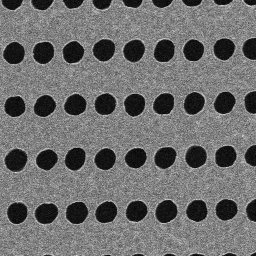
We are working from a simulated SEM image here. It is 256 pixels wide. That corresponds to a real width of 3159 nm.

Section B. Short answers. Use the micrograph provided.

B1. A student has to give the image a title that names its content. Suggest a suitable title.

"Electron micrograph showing a regular array of holes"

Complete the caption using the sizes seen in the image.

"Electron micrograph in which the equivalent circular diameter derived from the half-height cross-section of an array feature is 267 nm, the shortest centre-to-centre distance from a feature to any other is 363 nm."